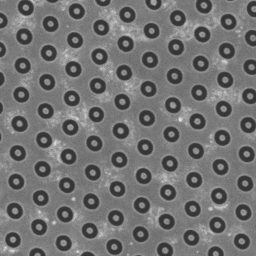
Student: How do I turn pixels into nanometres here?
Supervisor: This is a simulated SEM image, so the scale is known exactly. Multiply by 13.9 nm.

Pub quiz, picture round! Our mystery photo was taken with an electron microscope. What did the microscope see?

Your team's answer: a regular array of ring-shaped grooves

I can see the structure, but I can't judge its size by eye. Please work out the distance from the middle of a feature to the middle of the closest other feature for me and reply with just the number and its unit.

403 nm